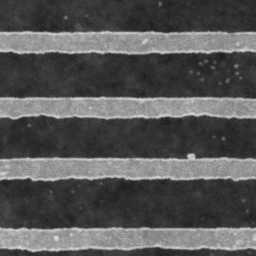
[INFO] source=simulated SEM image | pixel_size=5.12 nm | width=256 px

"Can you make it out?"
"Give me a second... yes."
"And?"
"lines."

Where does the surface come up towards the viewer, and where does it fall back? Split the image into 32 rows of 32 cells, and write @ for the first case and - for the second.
--------------------------------
--------------------------------
--------------------------------
--------------------------------
@@@@@@@@@@@@@@@@@@@@@@@@@@@@@@@@
@@@@@@@@@@@@@@@@@@@@@@@@@@@@@@@@
--@@@@-@@@@-@@@@@@@@@@@@@@@-@---
--------------------------------
--------------------------------
--------------------------------
--------------------------------
--------------------------------
@@@@@@@@@@@@@@@@@@@@@@@@@@@@@@@@
@@@@@@@@@@@@@@@@@@@@@@@@@@@@@@@@
@@@---@@@@@@@@@@@@@@@@@----@@@@@
--------------------------------
--------------------------------
--------------------------------
--------------------------------
--------------------------------
@@@@@@@@@@@@@@@@@@@@@@@@@@@@@@@@
@@@@@@@@@@@@@@@@@@@@@@@@@@@@@@@@
----@@@----------------------@--
--------------------------------
--------------------------------
--------------------------------
--------------------------------
--------------------------------
--------------------------------
@@@@@@@@@@@@@@@@@@@@@@@@@@@@@@@@
@@@@@@@@@@@@@@@@@@@@@@@@@@@@@@@@
--------------------------------